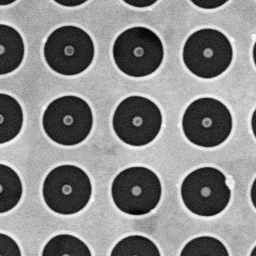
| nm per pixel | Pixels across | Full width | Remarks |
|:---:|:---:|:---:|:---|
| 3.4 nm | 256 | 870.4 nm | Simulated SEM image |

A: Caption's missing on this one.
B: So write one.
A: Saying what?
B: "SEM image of an array of small figures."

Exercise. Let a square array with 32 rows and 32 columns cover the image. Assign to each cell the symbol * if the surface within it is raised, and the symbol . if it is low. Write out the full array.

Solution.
..*****....*****...*****....****
********************************
********************************
..*****...******...******..*****
...***.....****.....****....****
...***......**......***......***
...**...*...**...*...**......**.
...***......**......***......***
..****.....****.....***......***
********.*******...*****....****
********************************
********************************
..*****....****....*****....****
...***.....***......***......***
...**.......**......***......**.
...**.......**......***......**.
...**......***......***......***
..****.....****....****.....****
*************************..*****
********************************
.*******.***********************
..****.....****....*****....****
...**......***......***.....****
...**...*...**......**.......**.
...**.......**......**.......**.
..****.....***......***......**.
.******...*****....*****....****
********************************
********************************
.******...******..*******..*****
..****.....***......***.....****
...**......***......**.......**.